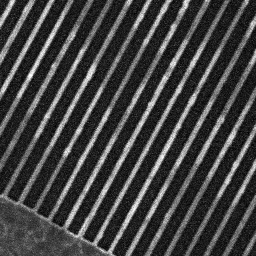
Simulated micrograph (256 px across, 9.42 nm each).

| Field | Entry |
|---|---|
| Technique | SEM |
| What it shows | parallel lines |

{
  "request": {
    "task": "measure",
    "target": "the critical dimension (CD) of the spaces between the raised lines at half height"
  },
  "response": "128 nm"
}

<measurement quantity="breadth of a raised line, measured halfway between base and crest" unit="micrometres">0.0321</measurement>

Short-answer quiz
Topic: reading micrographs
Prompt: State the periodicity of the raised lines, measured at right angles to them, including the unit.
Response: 0.162 um